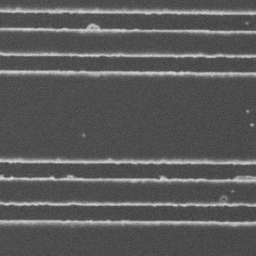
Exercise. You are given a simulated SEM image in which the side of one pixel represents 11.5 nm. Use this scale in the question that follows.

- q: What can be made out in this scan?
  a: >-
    lines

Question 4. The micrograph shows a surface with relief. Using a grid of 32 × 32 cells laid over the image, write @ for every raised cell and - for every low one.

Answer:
@@@@@@@@@@@@@@@@@@@@@@@@@@@@@@@@
----------------@-@@@@@@@@@@@@@@
--------------------------------
--------------------------------
@@@@@@@@@@@@@@@@@@@@@@@@@@@@@@@@
@@@@@@@@@@@@@@@@@@@@@@@@@@@@@@@@
@@@@@@@@@@@@@@@@@@@@@@@@@@@@@@@@
--------------------------------
--------------------------------
@@@@@@@@@@@@@@@@@@@@@@@@@@@@@@@@
@@@@@@@@@@@@@@@@@@@@@@@@@@@@@@@@
@@@@@@@@@@@@@@@@@@@@@@@@@@@@@@@@
@@@@@@@@@@@@@@@@@@@@@@@@@@@@@@@@
@@@@@@@@@@@@@@@@@@@@@@@@@@@@@@@@
@@@@@@@@@@@@@@@@@@@@@@@@@@@@@@@@
@@@@@@@@@@@@@@@@@@@@@@@@@@@@@@@@
@@@@@@@@@@@@@@@@@@@@@@@@@@@@@@@@
@@@@@@@@@@@@@@@@@@@@@@@@@@@@@@@@
@@@@@@@@@@@@@@@@@@@@@@@@@@@@@@@@
@@@@@@@@@@@@@@@@@@@@@@@@@@@@@@@@
--------------------------------
--------------------------------
@@@@@@@@@@@@@@@@@@@@@@@@@@------
@@@@@@@@@@@@@@@@@@@@@@@@@@@@@@@@
@@@@@@@@@@@@@@@@@@@@@@@@@@@@@@@@
@@@@@@@@@@@@@@@@@@@@@@@@@@@@@@@@
--------------------------------
--------------------------------
@@@@@@@@@@@@@@@@@@@@@@@@@@@@@@@@
@@@@@@@@@@@@@@@@@@@@@@@@@@@@@@@@
@@@@@@@@@@@@@@@@@@@@@@@@@@@@@@@@
@@@@@@@@@@@@@@@@@@@@@@@@@@@@@@@@